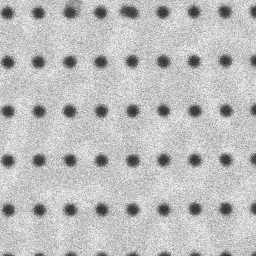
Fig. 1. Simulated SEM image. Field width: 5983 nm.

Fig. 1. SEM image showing a regular array of holes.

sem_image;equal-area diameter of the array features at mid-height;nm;308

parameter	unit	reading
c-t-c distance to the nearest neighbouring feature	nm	725